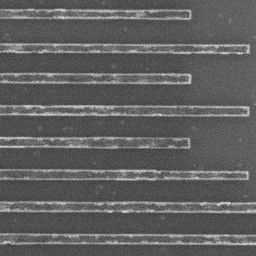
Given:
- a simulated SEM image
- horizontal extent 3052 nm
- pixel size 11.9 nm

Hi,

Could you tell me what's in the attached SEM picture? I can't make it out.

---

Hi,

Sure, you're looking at parallel lines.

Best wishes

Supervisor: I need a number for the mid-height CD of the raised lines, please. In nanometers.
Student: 106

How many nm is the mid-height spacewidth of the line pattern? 277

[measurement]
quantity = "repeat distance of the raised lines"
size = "383 nm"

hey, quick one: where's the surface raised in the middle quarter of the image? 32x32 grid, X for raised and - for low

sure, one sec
--------------------------------
--------------------------------
--------------------------------
XXXXXXXXXXXXXXXXXXXXXXXXXXXXXXXX
XXXXXXXXXXXXXXXXXXXXXXXXXXXXXXXX
--------------------------------
--------------------------------
--------------------------------
--------------------------------
--------------------------------
--------------------------------
XXXXXXXXXXXXXXXXXXXXXXXXXXXXXXXX
---XXXXXXXXXXXXXXXXXXXXXXXXXXXXX
--------------------------------
--------------------------------
--------------------------------
--------------------------------
--------------------------------
------XXXXXX--------------------
XXXXXXXXXXXXXXXXXXXXXXXXXXXXXXX-
XXXXXXXXXXXXXXXXXXXXXXXXXXXXXXX-
--------------------------------
--------------------------------
--------------------------------
--------------------------------
--------------------------------
--------------------------------
XXXXXXXXXXXXXXXXXXXXXXXXXXXXXXXX
XXXXXXXXXXXXXXXXXXXXXXXXXXXXXXXX
--------------------------------
--------------------------------
--------------------------------